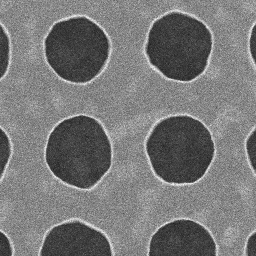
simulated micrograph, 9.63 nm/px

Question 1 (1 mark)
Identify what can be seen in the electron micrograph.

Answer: holes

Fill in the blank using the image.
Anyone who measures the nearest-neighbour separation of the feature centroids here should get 980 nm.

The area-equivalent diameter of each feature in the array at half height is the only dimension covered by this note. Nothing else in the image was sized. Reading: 644 nm